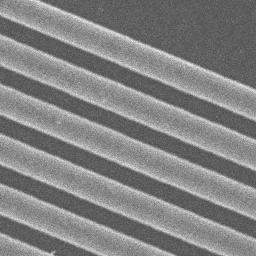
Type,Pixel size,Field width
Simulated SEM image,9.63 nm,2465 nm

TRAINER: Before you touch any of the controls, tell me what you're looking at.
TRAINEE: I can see parallel lines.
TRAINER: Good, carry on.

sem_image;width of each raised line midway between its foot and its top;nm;262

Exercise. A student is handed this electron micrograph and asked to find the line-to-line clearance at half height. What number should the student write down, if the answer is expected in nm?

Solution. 177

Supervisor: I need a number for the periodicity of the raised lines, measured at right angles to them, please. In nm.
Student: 442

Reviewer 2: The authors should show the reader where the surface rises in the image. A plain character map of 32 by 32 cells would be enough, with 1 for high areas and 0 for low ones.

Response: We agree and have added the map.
11111100000000000000000000000000
11111111000000000000000000000000
00111111110000000000000000000000
00001111111110000000000000000000
00000011111111100000000000000000
11100000011111111100000000000000
11111000000111111111000000000000
11111111000000111111111000000000
01111111110000001111111110000000
00011111111100000001111111100000
00000011111111100000011111111100
11000000111111111000000111111111
11111000000111111111000000111111
11111110000001111111110000001111
01111111100000001111111100000001
00011111111100000011111111100000
00000111111111000000111111111100
11000000111111111000000111111111
11110000001111111110000001111111
11111110000001111111110000001111
11111111100000011111111100000011
00111111111100000011111111000000
00000111111111000000111111111000
10000001111111110000001111111110
11110000001111111110000001111111
11111100000011111111100000011111
11111111000000011111111100000011
00111111111000000111111111000000
00001111111110000001111111111000
10000001111111110000001111111110
11100000011111111100000011111111
11111000000011111111100000011111